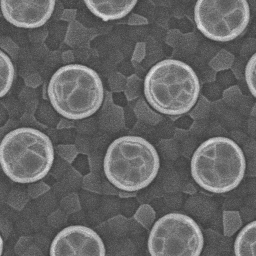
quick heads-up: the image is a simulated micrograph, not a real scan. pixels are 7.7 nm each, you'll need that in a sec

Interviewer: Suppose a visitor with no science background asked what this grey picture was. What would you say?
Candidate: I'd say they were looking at raised bodies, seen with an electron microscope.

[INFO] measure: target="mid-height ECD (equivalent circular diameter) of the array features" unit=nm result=394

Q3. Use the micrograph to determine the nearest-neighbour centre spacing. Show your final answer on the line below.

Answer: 666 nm